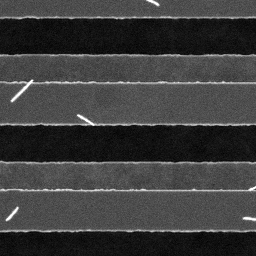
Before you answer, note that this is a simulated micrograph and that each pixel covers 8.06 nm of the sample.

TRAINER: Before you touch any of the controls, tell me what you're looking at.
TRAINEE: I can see lines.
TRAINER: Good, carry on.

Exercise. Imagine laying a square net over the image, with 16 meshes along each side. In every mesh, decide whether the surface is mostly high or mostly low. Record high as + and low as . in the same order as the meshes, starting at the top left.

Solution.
++++++++++++++++
................
................
++++++++++++++++
++++++++++++++++
++++++++++++++++
++++++++++++++++
++++++++++++++++
................
................
++++++++++++++++
++++++++++++++++
++++++++++++++++
++++++++++++++++
................
................